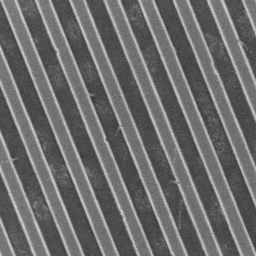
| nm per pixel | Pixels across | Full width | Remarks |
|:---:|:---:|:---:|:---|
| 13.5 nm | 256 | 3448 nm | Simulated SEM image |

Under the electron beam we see parallel lines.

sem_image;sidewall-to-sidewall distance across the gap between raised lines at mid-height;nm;242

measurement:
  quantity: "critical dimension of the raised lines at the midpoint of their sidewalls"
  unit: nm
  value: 194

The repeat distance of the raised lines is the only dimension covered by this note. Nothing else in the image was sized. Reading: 431 nm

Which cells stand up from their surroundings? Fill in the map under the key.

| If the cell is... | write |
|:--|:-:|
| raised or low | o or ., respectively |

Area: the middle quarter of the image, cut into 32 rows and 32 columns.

ooo.....oooo.....ooo.....oooo...
oooo....oooo.....oooo.....ooo...
oooo.....oooo.....ooo.....oooo..
.ooo.....oooo.....oooo....oooo..
.oooo.....ooo.....oooo.....oooo.
..ooo.....oooo.....ooo.....oooo.
..oooo....oooo.....oooo.....ooo.
..ooooo....oooo.....ooo.....oooo
...ooo.....oooo.....oooo....oooo
...oooo.....ooo.....oooo.....ooo
....ooo.....oooo.....ooo.....ooo
....oooo....oooo.....oooo.....oo
....oooo.....oooo....oooo.....oo
.....ooo.....oooo.....oooo....oo
.....oooo.....ooo.....oooo.....o
o.....ooo.....oooo.....ooo.....o
o.....oooo....oooo.....oooo.....
o.....oooo.....oooo....oooo.....
oo.....ooo.....oooo.....oooo....
oo.....oooo.....ooo.....oooo....
ooo.....ooo.....oooo.....ooo....
ooo.....oooo....oooo.....oooo...
oooo....oooo.....oooo.....ooo...
oooo.....ooo.....oooo.....oooo..
oooo.....oooo.....ooo.....oooo..
.oooo.....ooo.....oooo.....oooo.
.oooo.....oooo....oooo.....oooo.
..oooo....oooo.....oooo.....ooo.
..oooo.....ooo.....oooo.....oooo
..oooo.....oooo.....ooo.....oooo
...oooo.....ooo.....oooo.....ooo
...oooo.....oooo....oooo.....ooo